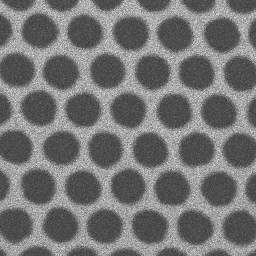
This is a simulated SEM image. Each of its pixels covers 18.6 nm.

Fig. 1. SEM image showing a regular array of holes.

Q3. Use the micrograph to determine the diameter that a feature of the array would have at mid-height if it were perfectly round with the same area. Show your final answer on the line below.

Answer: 0.667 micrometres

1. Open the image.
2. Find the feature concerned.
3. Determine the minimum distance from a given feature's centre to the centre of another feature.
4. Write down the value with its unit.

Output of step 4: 820 nm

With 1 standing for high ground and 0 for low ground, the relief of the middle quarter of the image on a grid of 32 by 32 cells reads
00011110000000011100000000111000
00001100000000011100000000111000
00001110000000011100000000011000
00001110000000011100000000011000
00011110000000111100000000111000
00111111000000111111000001111100
11111111111111111111100111111111
11100001111111000111111111000111
10000000111110000001111100000011
10000000011100000000111100000001
00000000011100000000111000000000
00000000011100000000011000000000
00000000011100000000111000000000
10000000011100000000111000000000
11000000111110000000111100000001
11100001111111100001111110000011
11111111111111111111111111111111
00111111000001111110000111111111
00011110000000111100000001111100
00001100000000111100000001111000
00001100000000011000000000111000
00001100000000011000000000111000
00001100000000011000000000111000
00011110000000111100000000111000
00111110000000111100000001111100
11111111000001111111000011111110
11111111111111100011111111111111
11000001111110000001111100000011
10000000111100000000111000000001
00000000011100000000111000000001
00000000011100000000011000000000
00000000011100000000110000000000